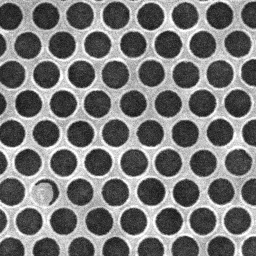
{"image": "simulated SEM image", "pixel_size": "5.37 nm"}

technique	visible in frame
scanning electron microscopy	a regular array of holes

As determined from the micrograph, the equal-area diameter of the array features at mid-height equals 155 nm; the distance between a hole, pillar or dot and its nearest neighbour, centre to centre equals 180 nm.